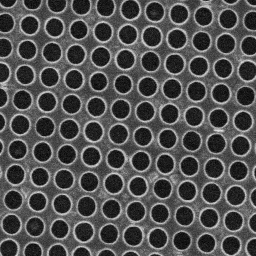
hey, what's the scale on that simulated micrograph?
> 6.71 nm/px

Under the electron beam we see a regular array of holes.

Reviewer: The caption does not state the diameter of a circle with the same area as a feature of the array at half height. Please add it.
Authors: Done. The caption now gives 126 nanometres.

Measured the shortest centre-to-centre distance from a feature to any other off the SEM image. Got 164 nm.